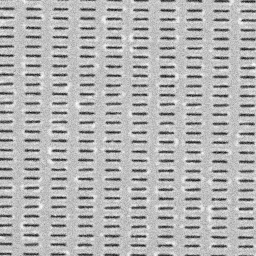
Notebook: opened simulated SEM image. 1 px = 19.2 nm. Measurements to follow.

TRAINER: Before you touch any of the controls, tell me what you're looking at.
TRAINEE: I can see a regular array of holes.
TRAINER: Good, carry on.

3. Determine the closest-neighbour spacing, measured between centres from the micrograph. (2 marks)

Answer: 174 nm